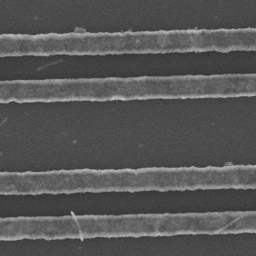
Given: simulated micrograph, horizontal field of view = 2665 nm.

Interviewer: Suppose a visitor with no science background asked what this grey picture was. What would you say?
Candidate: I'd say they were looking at lines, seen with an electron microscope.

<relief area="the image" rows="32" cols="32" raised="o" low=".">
................................
................................
................................
................................
oooooooooooooooooooooooooooooooo
oooooooooooooooooooooooooooooooo
ooooooooooooooooooooooo.........
................................
................................
........................oooooooo
oooooooooooooooooooooooooooooooo
oooooooooooooooooooooooooooooooo
ooooooooo...o...................
................................
................................
................................
................................
................................
................................
................................
................................
...o.ooooooooooooooooooooooooooo
oooooooooooooooooooooooooooooooo
oooooooooooooooooooooooooooo.oo.
................................
................................
...............................o
oooooooooooooooooooooooooooooooo
oooooooooooooooooooooooooooooooo
ooooooooooooooo.oo..............
................................
................................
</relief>